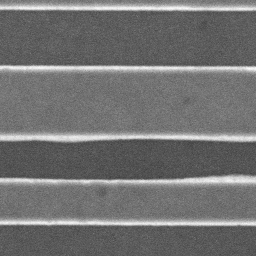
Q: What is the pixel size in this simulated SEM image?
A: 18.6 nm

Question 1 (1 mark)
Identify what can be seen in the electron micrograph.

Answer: lines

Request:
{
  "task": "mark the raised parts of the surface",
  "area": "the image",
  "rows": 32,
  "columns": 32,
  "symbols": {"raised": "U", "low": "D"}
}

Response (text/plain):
UUUUUUUUUUUUUUUUUUUUUUUUUUUUUUUU
DDDDDDDDDDDDDDDDDDDDDDDDDDDDDDDD
DDDDDDDDDDDDDDDDDDDDDDDDDDDDDDDD
DDDDDDDDDDDDDDDDDDDDDDDDDDDDDDDD
DDDDDDDDDDDDDDDDDDDDDDDDDDDDDDDD
DDDDDDDDDDDDDDDDDDDDDDDDDDDDDDDD
DDDDDDDDDDDDDDDDDDDDDDDDDDDDDDDD
DDDDDDDDDDDDDDDDDDDDDDDDDDDDDDDD
DDDDDDDDDDDDDDDDDDDDDDDDDDDDDDDD
UUUUUUUUUUUUUUUUUUUUUUUUUUUUUUUU
UUUUUUUUUUUUUUUUUUUUUUUUUUUUUUUU
UUUUUUUUUUUUUUUUUUUUUUUUUUUUUUUU
UUUUUUUUUUUUUUUUUUUUUUUUUUUUUUUU
UUUUUUUUUUUUUUUUUUUUUUUUUUUUUUUU
UUUUUUUUUUUUUUUUUUUUUUUUUUUUUUUU
UUUUUUUUUUUUUUUUUUUUUUUUUUUUUUUU
UUUUUUUUUUUUUUUUUUUUUUUUUUUUUUUU
DDDDDDDDDDDDDDDDDDDDDDDDDDDDDDDD
DDDDDDDDDDDDDDDDDDDDDDDDDDDDDDDD
DDDDDDDDDDDDDDDDDDDDDDDDDDDDDDDD
DDDDDDDDDDDDDDDDDDDDDDDDDDDDDDDD
DDDDDDDDDDDDDDDDDDDDDDDDDDDDDDDD
DDDDDDDDDDDDDDDDDDDDDDDDDDDDDDDD
UUUUUUUUUUUUUUUUUUUUUUUUUUUUUUUU
UUUUUUUUUUUUUUUUUUUUUUUUUUUUUUUU
UUUUUUUUUUUUUUUUUUUUUUUUUUUUUUUU
UUUUUUUUUUUUUUUUUUUUUUUUUUUUUUUU
UUUUUUUUUUUUUUUUUUUUUUUUUUUUUUUU
DDDDDDDDDDDDDDDDDDDDDDDDDDDDDDDD
DDDDDDDDDDDDDDDDDDDDDDDDDDDDDDDD
DDDDDDDDDDDDDDDDDDDDDDDDDDDDDDDD
DDDDDDDDDDDDDDDDDDDDDDDDDDDDDDDD